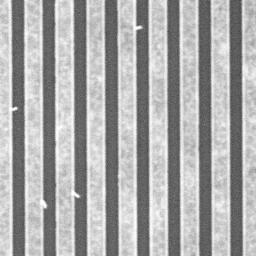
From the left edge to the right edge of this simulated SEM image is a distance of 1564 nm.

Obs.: parallel lines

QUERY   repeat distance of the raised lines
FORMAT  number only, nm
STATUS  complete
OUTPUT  190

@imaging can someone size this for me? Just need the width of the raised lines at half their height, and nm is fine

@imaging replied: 99.3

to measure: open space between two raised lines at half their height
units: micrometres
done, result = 0.0932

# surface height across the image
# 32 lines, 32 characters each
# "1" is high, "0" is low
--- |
10011001100110011001100110010011
10011001100110011001100110010011
10011001100110011001100110010001
10011001100110011001100110010011
10011001100110011001100110010011
10011001100110011001100110010001
10011001100110011001100110010001
10011001100110011001100110010001
10011001100110011001100110010001
10011001100110011001100110011001
10011001100110011001100110011011
10011001100110011001100110011011
10011001100110011001100110011011
11011001100110011001100110011011
10011001100110011001100110011011
10011001100110011001100110011001
10011001100110011001100110011001
10011001100110011001100110011011
10011001100110011001100110011011
10011001100110011001100110011011
10011001100110011001100110011011
10011001100110011001100110011001
10011001100110011001100110011001
10011001100110011001100110011001
10011001100110011001100110011001
10011001100110011001100110011001
10011001100110011001100110011001
10011001100110011001100110011001
10011001100110011001100110011001
10011001100110011001100110011001
10011001100110011001100110011001
10011001100110011001100110011001